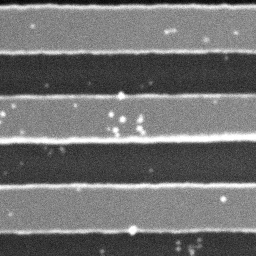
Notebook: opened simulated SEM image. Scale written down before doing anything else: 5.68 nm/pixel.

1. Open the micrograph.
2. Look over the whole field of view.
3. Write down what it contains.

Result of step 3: lines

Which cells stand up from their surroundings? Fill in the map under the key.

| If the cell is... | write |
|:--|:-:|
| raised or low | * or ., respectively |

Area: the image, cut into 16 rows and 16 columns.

****************
****************
****************
................
................
................
****************
****************
****************
................
................
................
****************
****************
*********.**....
................